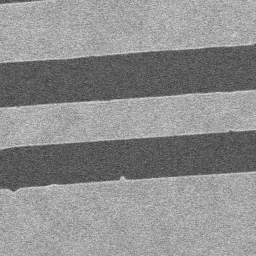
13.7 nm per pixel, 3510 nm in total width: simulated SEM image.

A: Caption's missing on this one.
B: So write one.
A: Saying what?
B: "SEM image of one or a few lines or trenches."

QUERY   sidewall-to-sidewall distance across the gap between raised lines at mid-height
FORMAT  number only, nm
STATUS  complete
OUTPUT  624